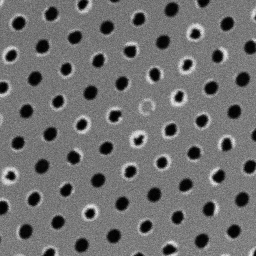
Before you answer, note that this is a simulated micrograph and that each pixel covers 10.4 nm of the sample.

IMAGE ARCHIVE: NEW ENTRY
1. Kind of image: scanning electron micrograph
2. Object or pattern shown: a regular array of holes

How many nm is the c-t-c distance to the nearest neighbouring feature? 343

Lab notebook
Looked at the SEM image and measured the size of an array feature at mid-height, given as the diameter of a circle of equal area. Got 143 nm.